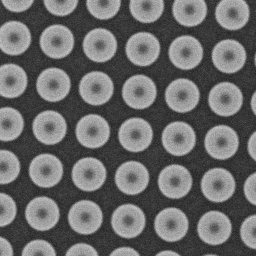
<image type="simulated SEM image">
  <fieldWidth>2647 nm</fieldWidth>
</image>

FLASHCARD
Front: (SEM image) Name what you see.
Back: an array of small figures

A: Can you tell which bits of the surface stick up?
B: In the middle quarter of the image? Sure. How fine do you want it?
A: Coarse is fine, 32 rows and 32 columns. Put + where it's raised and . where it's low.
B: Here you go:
............................++++
................................
......++++......................
+....++++++.....+++++...........
+...++++++++....++++++.....+++++
+...++++++++...++++++++...++++++
+...++++++++...++++++++...++++++
+...++++++++...++++++++..+++++++
.....+++++++...++++++++..+++++++
......++++.....+++++++....++++++
.................++++.....++++++
............................++++
................................
.....++++.......................
....+++++++....++++++...........
...++++++++...+++++++.....+++++.
...++++++++...++++++++...+++++++
...++++++++...++++++++...+++++++
...++++++++...++++++++...+++++++
....++++++....++++++++...+++++++
.....++++......++++++....+++++++
................++++......++++++
...........................+++..
................................
...++++++.......+...............
...+++++++....++++++......+++...
..++++++++...++++++++....++++++.
..++++++++...++++++++...+++++++.
..++++++++...++++++++...++++++++
...+++++++...++++++++...++++++++
...++++++....++++++++...++++++++
.....+++......++++++....+++++++.